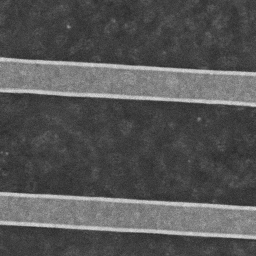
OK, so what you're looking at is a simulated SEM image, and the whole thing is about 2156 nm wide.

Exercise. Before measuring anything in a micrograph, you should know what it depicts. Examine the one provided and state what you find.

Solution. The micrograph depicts one or a few lines or trenches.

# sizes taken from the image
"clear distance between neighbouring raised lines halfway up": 861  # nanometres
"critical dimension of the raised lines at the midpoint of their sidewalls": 30.8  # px